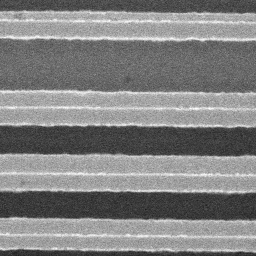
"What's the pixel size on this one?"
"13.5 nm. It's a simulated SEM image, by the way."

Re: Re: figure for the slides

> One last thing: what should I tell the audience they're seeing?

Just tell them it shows lines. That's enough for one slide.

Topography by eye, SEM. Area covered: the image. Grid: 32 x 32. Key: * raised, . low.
................................
..****..........................
********************************
********************************
********************************
................................
................................
................................
................................
................................
................................
*********.......................
********************************
********************************
********************************
********************************
................................
................................
................................
*********...**..................
********************************
********************************
********************************
********************************
................................
................................
................................
**************..................
********************************
********************************
********************************
................................